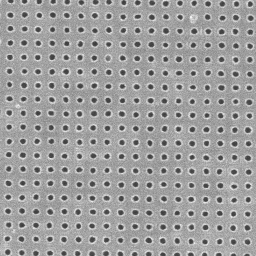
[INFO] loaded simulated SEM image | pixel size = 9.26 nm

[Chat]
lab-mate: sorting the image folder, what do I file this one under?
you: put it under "a regular array of holes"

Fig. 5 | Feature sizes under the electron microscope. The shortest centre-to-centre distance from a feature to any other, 126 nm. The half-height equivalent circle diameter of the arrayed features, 0.0523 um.